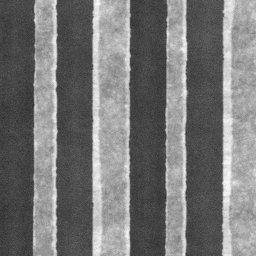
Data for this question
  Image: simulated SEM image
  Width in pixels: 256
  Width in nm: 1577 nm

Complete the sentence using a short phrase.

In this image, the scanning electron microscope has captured lines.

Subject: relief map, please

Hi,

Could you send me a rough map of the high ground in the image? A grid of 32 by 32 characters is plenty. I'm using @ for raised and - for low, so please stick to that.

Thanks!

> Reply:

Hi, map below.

----@@@-----@@@@-----@@------@@@
----@@@-----@@@@-----@@------@@@
----@@@-----@@@@-----@@-----@@@@
----@@@-----@@@@-----@@-----@@@@
----@@@-----@@@@-----@@-----@@@@
----@@@-----@@@@-----@@-----@@@@
----@@@-----@@@@-----@@-----@@@@
----@@@-----@@@@-----@@-----@@@@
----@@@-----@@@@-----@@-----@@@@
----@@@-----@@@@-----@@-----@@@@
----@@@-----@@@@-----@@-----@@@@
----@@@-----@@@@-----@@-----@@@@
----@@@-----@@@@-----@@-----@@@@
----@@@-----@@@@-----@@-----@@@@
----@@@-----@@@@-----@@-----@@@@
----@@@-----@@@@-----@@-----@@@@
----@@@-----@@@@-----@@-----@@@@
----@@@-----@@@@-----@@-----@@@@
----@@@-----@@@@-----@@-----@@@@
----@@@-----@@@@-----@@-----@@@@
----@@@-----@@@@-----@@-----@@@@
----@@@-----@@@@-----@@-----@@@@
----@@@-----@@@@-----@@-----@@@@
----@@@-----@@@@-----@@-----@@@@
----@@@-----@@@@-----@@-----@@@@
----@@@-----@@@@-----@@-----@@@@
----@@@-----@@@@-----@@-----@@@@
----@@@-----@@@@-----@@-----@@@@
----@@@-----@@@@-----@@-----@@@@
----@@@-----@@@@-----@@-----@@@@
----@@@-----@@@@-----@@-----@@@@
----@@@-----@@@@-----@@-----@@@@